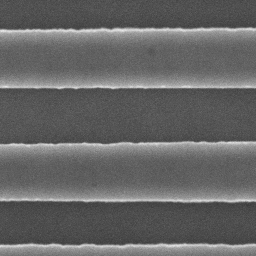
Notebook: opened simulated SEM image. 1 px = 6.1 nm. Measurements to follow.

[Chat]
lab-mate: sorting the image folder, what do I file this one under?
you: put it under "lines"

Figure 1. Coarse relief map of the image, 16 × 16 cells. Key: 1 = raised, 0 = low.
0000000000000000
0000000000000000
1111111111111111
1111111111111111
1111111111111111
0001100100000000
0000000000000000
0000000000000000
0000000000000000
1111111111111111
1111111111111111
1111111111111111
0000010100111111
0000000000000000
0000000000000000
1111111111111111